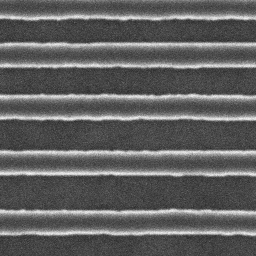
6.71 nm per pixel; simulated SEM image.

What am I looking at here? lines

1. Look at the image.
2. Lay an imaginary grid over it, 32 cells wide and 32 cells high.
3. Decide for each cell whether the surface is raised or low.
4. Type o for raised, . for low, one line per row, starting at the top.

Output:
oooooooooooooooooooooooooooooooo
oooooooooooooooooooooooooooooooo
................................
................................
................................
.oooo.......ooooo...ooooooooooo.
oooooooooooooooooooooooooooooooo
oooooooooooooooooooooooooooooooo
................................
................................
................................
................................
oooooooooooooooooooooooooooooooo
oooooooooooooooooooooooooooooooo
oooooooooooooooooooooooooooooooo
................................
................................
................................
................................
oooooooooooooooooooooooooooooooo
oooooooooooooooooooooooooooooooo
oooooooooooooooooooooooooooooooo
................................
................................
................................
................................
oooooooooooooo.oooooooooooooooo.
oooooooooooooooooooooooooooooooo
oooooooooooooooooooooooooooooooo
................................
................................
................................